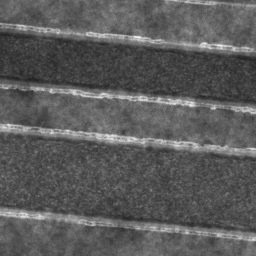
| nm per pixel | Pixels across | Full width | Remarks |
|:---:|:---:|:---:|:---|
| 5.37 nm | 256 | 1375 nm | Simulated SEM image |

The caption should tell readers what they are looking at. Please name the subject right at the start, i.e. one or a few lines or trenches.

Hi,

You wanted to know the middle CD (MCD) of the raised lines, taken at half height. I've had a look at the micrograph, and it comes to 46.2 pixels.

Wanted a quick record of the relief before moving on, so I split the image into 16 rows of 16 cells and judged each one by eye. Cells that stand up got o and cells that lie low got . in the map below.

oooooooooooooooo
oooooooooooooooo
.......ooooooooo
................
................
oooo............
oooooooooooooo..
oooooooooooooooo
.....ooooooooooo
...............o
................
................
................
ooo.............
ooooooooooooo...
oooooooooooooooo